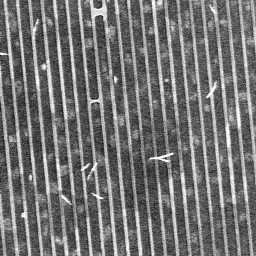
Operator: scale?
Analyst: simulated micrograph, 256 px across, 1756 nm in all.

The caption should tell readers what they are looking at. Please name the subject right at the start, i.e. parallel lines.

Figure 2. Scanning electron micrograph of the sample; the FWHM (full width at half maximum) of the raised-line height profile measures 16.2 nm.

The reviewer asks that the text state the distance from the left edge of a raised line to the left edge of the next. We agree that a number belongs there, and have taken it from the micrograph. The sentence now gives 84.2 nanometres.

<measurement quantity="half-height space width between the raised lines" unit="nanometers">64.9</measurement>